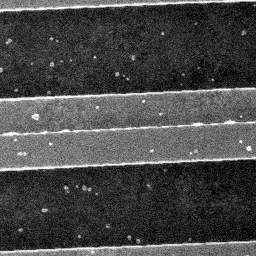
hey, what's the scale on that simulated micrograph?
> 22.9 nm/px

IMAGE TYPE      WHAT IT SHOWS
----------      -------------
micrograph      lines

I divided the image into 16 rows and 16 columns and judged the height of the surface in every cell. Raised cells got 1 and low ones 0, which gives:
1111000000000000
0000000000000000
0000000000000000
0000000000000000
0000000000000000
0000000000000000
1111111111111111
1111111111111111
1111111111111111
1111111111111111
1110000000000000
0000000000000000
0000000000000000
0000000000000000
0000000000000000
0000000111111111